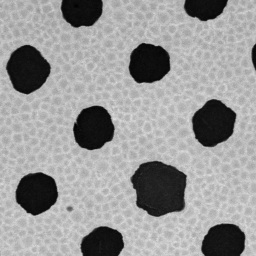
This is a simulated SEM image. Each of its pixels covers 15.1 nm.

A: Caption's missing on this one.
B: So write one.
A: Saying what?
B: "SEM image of holes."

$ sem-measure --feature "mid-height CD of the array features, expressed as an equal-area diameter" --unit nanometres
649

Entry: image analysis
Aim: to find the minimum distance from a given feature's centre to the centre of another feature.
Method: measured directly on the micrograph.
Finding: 1280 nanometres